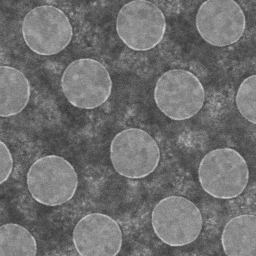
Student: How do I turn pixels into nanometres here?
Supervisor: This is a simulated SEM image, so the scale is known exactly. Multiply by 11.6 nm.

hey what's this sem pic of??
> raised bodies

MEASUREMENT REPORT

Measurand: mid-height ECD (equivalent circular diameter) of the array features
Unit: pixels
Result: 49.6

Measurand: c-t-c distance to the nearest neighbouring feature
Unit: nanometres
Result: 772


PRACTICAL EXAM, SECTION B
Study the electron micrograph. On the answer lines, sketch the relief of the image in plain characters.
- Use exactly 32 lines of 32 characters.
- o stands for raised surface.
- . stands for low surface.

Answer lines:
................ooo......ooooo..
....oooo.......ooooo.....ooooo..
...oooooo......oooooo....oooooo.
...oooooo......oooooo....oooooo.
...oooooo......ooooo.....ooooo..
...ooooo........oooo......ooo...
....ooo.........................
..........oo....................
o.......ooooo...................
ooo.....oooooo......oooo........
oooo....oooooo......ooooo.....oo
oooo....oooooo.....oooooo.....oo
oooo.....oooo......oooooo.....oo
ooo.......oo........ooooo.....oo
o....................ooo......oo
................................
...............ooo..............
..............ooooo.............
o.............oooooo............
o.....o.......oooooo......oooo..
oo..ooooo.....oooooo.....oooooo.
o...ooooo......oooo......oooooo.
o..ooooooo...............oooooo.
....oooooo...............ooooo..
....ooooo..................ooo..
.....ooo............oooo........
...................oooooo.......
..........oooo.....oooooo....ooo
ooo......oooooo....oooooo...oooo
oooo.....oooooo.....ooooo...oooo
oooo.....oooooo...o..oo.....oooo
oooo......ooooo.............oooo